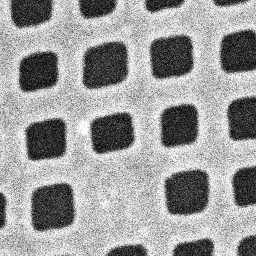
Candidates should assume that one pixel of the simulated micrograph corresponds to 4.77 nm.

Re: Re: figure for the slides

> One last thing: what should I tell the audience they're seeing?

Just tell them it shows a regular array of holes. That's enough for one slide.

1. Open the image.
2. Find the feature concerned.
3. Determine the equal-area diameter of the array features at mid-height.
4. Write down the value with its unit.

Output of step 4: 216 nm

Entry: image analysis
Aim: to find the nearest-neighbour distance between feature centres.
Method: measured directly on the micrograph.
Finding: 0.32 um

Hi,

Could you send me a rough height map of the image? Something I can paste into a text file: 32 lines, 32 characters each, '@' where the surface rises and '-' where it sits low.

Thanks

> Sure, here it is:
@------@@@-----@@@-----@@@@---@@
@------@@@----@@@@@-@@@@@@@@@@@@
@-----@@@@@@@@@@@@@@@@@@@@@@@@@@
@@@@@@@@@@@@@@@@@@@@@@@@@@@@@@@@
@@@@@@@@@@@@@@@@@@@@@@-@@@@@----
@@@@@@@@@@@@@---@@@-----@@@@----
@@@@@--@@@@-----@@@-----@@@-----
@@@----@@@------@@@-----@@@@----
@@-----@@@------@@@-----@@@@----
@@-----@@@------@@@----@@@@@@@@@
@@-----@@@-----@@@@@@@@@@@@@@@@@
@@@-@@@@@@@@@@@@@@@@@@@@@@@@@@@@
@@@@@@@@@@@@@@@@@@@@@@@@@@@@@---
@@@@@@@@@@@@@@@@@@@@@----@@@----
@@@@@@@@@@@@@---@@@@-----@@@----
@@@@----@@@------@@@-----@@@@---
@@@-----@@@------@@@-----@@@@---
@@@-----@@@------@@@----@@@@@--@
@@@-----@@@@----@@@@@@@@@@@@@@@@
@@@-----@@@@@@@@@@@@@@@@@@@@@@@@
@@@@@@@@@@@@@@@@@@@@@@@@@@@@@@@@
@@@@@@@@@@@@@@@@@@@@@@----@@@---
@@@@@@@@@@@@@@@@@@@@@-----@@@---
@@@@@----@@@@@@@@@@@------@@@---
-@@@-----@@@@@@@@@@@@-----@@@---
-@@@-----@@@@@@@@@@@@-----@@@@--
-@@@-----@@@@@@@@@@@@----@@@@@@@
-@@@-----@@@@@@@@@@@@@@@@@@@@@@@
@@@@----@@@@@@@@@@@@@@@@@@@@@@@@
@@@@@@@@@@@@@@@@@@@@@@@@@@@@@@@-
@@@@@@@@@@@@@@@@@@@@@@-----@@@--
@@@@@@@@@@@@@@----@@@@-----@@@--